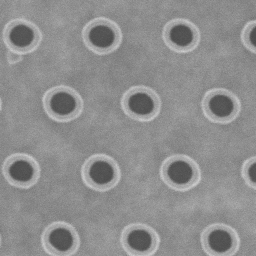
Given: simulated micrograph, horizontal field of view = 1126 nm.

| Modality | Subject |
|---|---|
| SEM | a regular array of ring-shaped raised bodies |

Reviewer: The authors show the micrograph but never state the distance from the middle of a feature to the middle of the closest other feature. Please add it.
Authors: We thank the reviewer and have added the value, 343 nm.